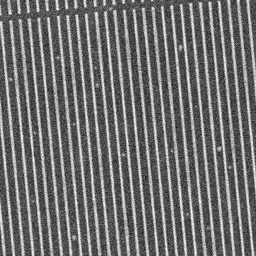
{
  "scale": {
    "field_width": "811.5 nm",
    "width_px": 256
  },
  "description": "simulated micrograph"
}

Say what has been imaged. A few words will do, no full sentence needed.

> parallel lines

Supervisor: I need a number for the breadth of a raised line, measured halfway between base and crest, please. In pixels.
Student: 1.99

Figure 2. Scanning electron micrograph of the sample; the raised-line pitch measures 30.2 nm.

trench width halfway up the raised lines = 24.4 nanometers